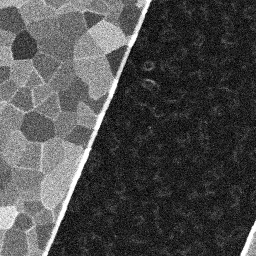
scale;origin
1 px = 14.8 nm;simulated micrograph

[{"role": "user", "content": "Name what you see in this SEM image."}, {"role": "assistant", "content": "one or a few lines or trenches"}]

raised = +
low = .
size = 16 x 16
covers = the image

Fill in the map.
+++++++++.......
+++++++++.......
++++++++........
++++++++........
+++++++.........
+++++++.........
+++++++.........
++++++..........
++++++..........
+++++...........
+++++...........
+++++...........
++++............
++++............
+++.............
+++............+